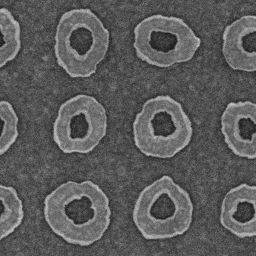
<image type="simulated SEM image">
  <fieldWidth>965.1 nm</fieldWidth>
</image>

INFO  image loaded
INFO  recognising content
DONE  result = ring-shaped raised bodies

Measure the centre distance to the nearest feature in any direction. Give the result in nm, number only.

306